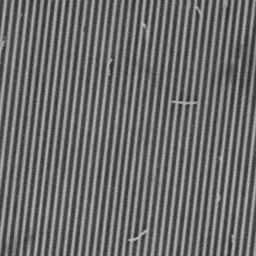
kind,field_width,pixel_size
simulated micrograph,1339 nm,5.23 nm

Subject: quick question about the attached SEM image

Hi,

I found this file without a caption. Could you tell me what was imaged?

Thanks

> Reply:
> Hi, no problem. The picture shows parallel lines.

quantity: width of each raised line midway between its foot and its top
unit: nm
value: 14.3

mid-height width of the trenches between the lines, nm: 24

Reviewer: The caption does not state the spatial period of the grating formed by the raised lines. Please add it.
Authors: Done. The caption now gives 38 nm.